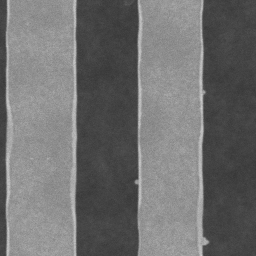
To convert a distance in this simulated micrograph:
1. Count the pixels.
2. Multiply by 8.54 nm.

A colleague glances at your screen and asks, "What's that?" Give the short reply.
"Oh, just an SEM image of wiring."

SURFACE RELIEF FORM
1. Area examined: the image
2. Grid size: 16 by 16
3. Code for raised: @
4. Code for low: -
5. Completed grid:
-@@@@----@@@@---
@@@@@----@@@@---
@@@@@----@@@@---
@@@@@----@@@@---
@@@@@----@@@@---
@@@@@----@@@@---
@@@@@----@@@@---
-@@@@----@@@@---
-@@@@----@@@@---
-@@@@----@@@@---
@@@@@----@@@@---
-@@@@----@@@@---
@@@@@----@@@@---
@@@@@----@@@----
@@@@@----@@@----
@@@@@----@@@@---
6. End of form